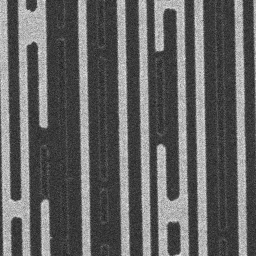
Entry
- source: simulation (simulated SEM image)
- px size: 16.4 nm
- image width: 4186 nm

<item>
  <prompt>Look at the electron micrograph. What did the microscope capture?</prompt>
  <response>parallel lines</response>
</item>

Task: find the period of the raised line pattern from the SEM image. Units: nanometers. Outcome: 321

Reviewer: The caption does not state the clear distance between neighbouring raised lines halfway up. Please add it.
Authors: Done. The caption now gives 192 nanometres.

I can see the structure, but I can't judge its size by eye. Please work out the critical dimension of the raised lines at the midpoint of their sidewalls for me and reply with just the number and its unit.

127 nm